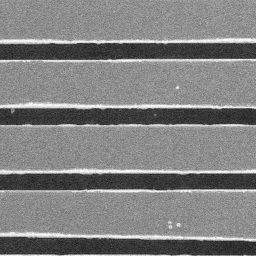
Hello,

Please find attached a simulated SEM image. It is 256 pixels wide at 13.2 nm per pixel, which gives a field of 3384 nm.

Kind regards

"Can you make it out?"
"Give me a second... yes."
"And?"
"lines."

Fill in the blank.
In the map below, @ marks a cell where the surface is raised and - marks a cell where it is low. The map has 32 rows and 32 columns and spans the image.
@@@@@@@@@@@@@@@@@@@@@@@@@@@@@@@@
@@@@@@@@@@@@@@@@@@@@@@@@@@@@@@@@
@@@@@@@@@@@@@@@@@@@@@@@@@@@@@@@@
@@@@@@@@@@@@@@@@@@@@@@@@@@@@@@@@
@@@@@@@@@@@@@@@@@@@@@@@@@@@@@@@@
--------------------------------
--------------------------------
---------------@@@@@@@@@@@@@@@@@
@@@@@@@@@@@@@@@@@@@@@@@@@@@@@@@@
@@@@@@@@@@@@@@@@@@@@@@@@@@@@@@@@
@@@@@@@@@@@@@@@@@@@@@@@@@@@@@@@@
@@@@@@@@@@@@@@@@@@@@@@@@@@@@@@@@
@@@@@@@@@@@@@@@@@@@@@@@@@@@@@@@@
--------------------------------
--------------------------------
--------------------------------
@@@@@@@@@@@@@@@@@@@@@@@@@@@@@@@@
@@@@@@@@@@@@@@@@@@@@@@@@@@@@@@@@
@@@@@@@@@@@@@@@@@@@@@@@@@@@@@@@@
@@@@@@@@@@@@@@@@@@@@@@@@@@@@@@@@
@@@@@@@@@@@@@@@@@@@@@@@@@@@@@@@@
@@@@@@@@@-@@@-@@@@--@@@@@@@@@@@-
--------------------------------
--------------------------------
@@@@@@@@@@@@@@@@@@@@@@@@@@@@@@@@
@@@@@@@@@@@@@@@@@@@@@@@@@@@@@@@@
@@@@@@@@@@@@@@@@@@@@@@@@@@@@@@@@
@@@@@@@@@@@@@@@@@@@@@@@@@@@@@@@@
@@@@@@@@@@@@@@@@@@@@@@@@@@@@@@@@
--@@@@@@@@@@@@@@@@@@@@@@@@@@@@@@
--------------------------------
--------------------------------